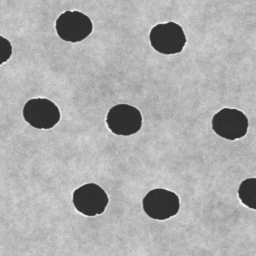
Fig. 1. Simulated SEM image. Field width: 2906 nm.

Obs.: holes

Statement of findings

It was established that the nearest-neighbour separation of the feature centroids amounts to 0.942 µm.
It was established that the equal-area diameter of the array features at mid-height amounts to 386 nanometres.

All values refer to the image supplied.